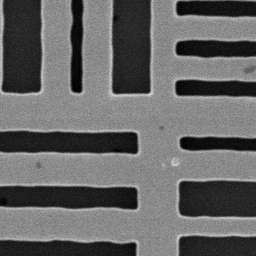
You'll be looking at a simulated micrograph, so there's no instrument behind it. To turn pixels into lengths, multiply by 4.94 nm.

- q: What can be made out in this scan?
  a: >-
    groups of lines, slits or small figures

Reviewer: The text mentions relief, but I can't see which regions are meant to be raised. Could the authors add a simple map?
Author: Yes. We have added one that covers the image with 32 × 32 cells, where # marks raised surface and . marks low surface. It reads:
.....####.####.....###..........
.....####.####.....###..........
.....####.####.....#############
.....####.####.....#############
.....####.####.....#############
.....####.####.....###..........
.....####.####.....###..........
.....####.####.....#############
.....####.####.....#############
.....####.####.....#############
.....####.####.....###..........
.....####.####.....###..........
################################
################################
################################
################################
.................###############
.................#####..........
.................######.........
################################
################################
################################
##########################....##
.................#####..........
.................#####..........
.................#####..........
######################..........
################################
################################
#######################.........
.................#####..........
.................#####..........